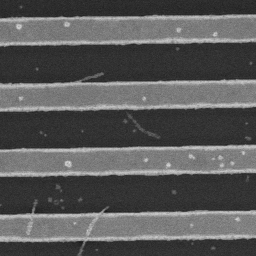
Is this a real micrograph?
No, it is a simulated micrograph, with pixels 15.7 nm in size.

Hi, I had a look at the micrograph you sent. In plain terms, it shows lines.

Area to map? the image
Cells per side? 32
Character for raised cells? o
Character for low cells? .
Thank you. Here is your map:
................................
................................
oooooooooooooooooooooooooooooooo
oooooooooooooooooooooooooooooooo
oooooooooooooooooooooooooooooooo
oooooo..........................
................................
................................
................................
................................
.......ooooooooooooooooooooooooo
oooooooooooooooooooooooooooooooo
oooooooooooooooooooooooooooooooo
oooooooooooooooooooooo..........
................................
................................
................................
................................
................oooooooooooooooo
oooooooooooooooooooooooooooooooo
oooooooooooooooooooooooooooooooo
oooooooooooooooooooooooooooooooo
................................
................................
................................
................................
........................oooooooo
oooooooooooooooooooooooooooooooo
oooooooooooooooooooooooooooooooo
oooooooooooooooooooooooooooooooo
................................
................................